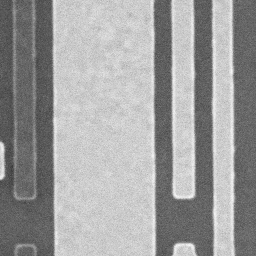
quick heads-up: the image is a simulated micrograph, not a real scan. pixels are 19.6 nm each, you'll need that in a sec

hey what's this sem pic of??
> wiring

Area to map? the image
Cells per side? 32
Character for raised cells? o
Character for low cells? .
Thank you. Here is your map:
..oo...oooooooooooo...oo...oo...
..oo...oooooooooooo...oo...oo...
..oo...oooooooooooo...oo...oo...
..oo...oooooooooooo...oo...oo...
..oo...oooooooooooo...oo...oo...
..oo...oooooooooooo...oo...oo...
..oo...oooooooooooo...oo...oo...
..oo...oooooooooooo...oo...oo...
..oo...oooooooooooo...oo...oo...
..oo...oooooooooooo...oo...oo...
..oo...oooooooooooo...oo...oo...
..oo...oooooooooooo...oo...oo...
..oo...oooooooooooo...oo...oo...
..oo...oooooooooooo...oo...oo...
..oo...oooooooooooo...oo...oo...
..oo...oooooooooooo...oo...oo...
..oo...oooooooooooo...oo...oo...
..oo...oooooooooooo...oo...oo...
..oo...oooooooooooo...oo...oo...
..oo...oooooooooooo...oo...oo...
..oo...oooooooooooo...oo...oo...
..oo...oooooooooooo...oo...oo...
..oo...oooooooooooo...oo...oo...
..oo...oooooooooooo...oo...oo...
..oo...oooooooooooo...oo...oo...
.......oooooooooooo........oo...
.......oooooooooooo........oo...
.......oooooooooooo........oo...
.......oooooooooooo........oo...
.......oooooooooooo........oo...
.......oooooooooooo........oo...
..oo...oooooooooooo...oo...oo...